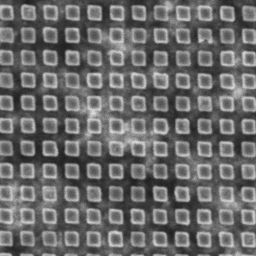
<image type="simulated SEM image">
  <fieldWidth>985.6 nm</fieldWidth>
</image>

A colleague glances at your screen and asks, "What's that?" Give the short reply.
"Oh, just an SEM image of a regular array of raised bodies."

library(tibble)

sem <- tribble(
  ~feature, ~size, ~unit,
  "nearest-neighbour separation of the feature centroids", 84.8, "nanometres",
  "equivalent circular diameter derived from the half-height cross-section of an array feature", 60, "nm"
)